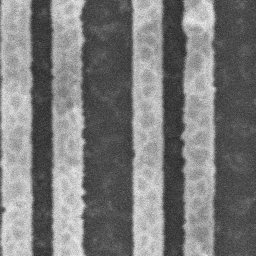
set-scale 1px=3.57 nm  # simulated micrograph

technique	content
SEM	one or a few lines or trenches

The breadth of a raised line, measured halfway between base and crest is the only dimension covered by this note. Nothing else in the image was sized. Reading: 0.0932 micrometres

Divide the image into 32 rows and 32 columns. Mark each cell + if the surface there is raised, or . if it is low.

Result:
++++...+++.......+++...+++......
++++...+++.......+++...+++......
++++...+++.......+++...+++......
+++....+++.......+++...+++......
++++...+++.......+++...+++......
++++...+++.......+++....++......
++++...+++.......+++....++......
++++...+++.......+++...+++......
++++...+++.......+++...+++......
++++...+++.......+++...+++......
++++...+++.......+++...+++......
++++...+++.......+++...++++.....
++++...+++.......+++...+++......
++++...+++.......+++...++++.....
++++...+++.......+++...+++......
++++...+++.......+++...+++......
.+++...+++.......+++...++++.....
++++...+++.......+++...+++......
++++...+++.......+++...+++......
.+++...+++.......+++...+++......
.+++...+++.......+++...++++.....
.+++...+++.......+++...+++......
.+++...+++.......+++...+++......
.+++...+++.......+++...++++.....
.+++...+++.......+++...+++......
++++...+++.......+++...+++......
.+++...+++.......+++...+++......
.+++...+++.......+++...++++.....
.+++...+++.......+++...++++.....
.+++...+++.......+++...+++......
++++...+++.......+++...+++......
.+++...+++.......+++...+++......